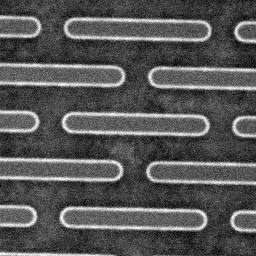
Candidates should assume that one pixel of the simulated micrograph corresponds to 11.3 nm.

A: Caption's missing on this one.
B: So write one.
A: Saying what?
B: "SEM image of groups of lines, slits or small figures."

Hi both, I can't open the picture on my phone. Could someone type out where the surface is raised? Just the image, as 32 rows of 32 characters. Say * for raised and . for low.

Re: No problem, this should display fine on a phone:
................................
................................
****.....*********..............
*****...******************....**
..**.....*****************....**
................................
................................
................................
***************.................
***************....*************
......*********....*************
................................
................................
................................
****....*************...........
*****...******************...***
..........****************....**
................................
................................
................................
***************....******.......
***************...**************
...................*************
................................
................................
................................
****....*****************.......
****....******************...***
...................******....***
................................
................................
................................